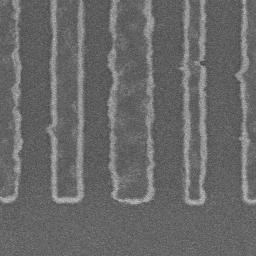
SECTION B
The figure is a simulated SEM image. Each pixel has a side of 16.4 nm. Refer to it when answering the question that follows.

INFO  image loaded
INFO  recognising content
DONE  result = one or a few lines or trenches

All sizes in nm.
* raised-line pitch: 1050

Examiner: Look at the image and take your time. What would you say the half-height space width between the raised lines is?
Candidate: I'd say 597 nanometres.